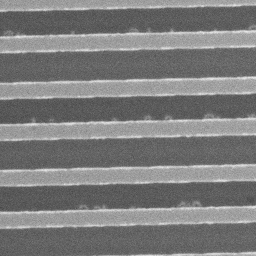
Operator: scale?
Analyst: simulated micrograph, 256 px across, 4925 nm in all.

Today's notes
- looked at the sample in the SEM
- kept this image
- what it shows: lines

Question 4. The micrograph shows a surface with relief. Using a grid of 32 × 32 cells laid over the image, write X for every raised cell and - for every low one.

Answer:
XXXXXXXXXXXXXXXXXXXXXXXXXXXXXXXX
--------------------------------
--------------------------------
--------------------------------
-----XXXXXXXXXXXXXXXXXXXXXXXXXXX
XXXXXXXXXXXXXXXXXXXXXXXXXXXXXXXX
XXX-----------------------------
--------------------------------
--------------------------------
--------------------------------
XXXXXXXXXXXXXXXXXXXXXXXXXXXXXXXX
XXXXXXXXXXXXXXXXXXXXXXXXXXXXXXXX
--------------------------------
--------------------------------
--------------------------------
--XXXXXXXXXXXXXXXXXXXXXXXXXXXXXX
XXXXXXXXXXXXXXXXXXXXXXXXXXXXXXXX
--------------------------------
--------------------------------
--------------------------------
--------------------------------
XXXXXXXXXXXXXXXXXXXXXXXXXXXXXXXX
XXXXXXXXXXXXXXXXXXXXXXXXXXXXXXXX
--------------------------------
--------------------------------
--------------------------------
--XXXXXXXXXXXXXXXXXXXXXXXXXXXXXX
XXXXXXXXXXXXXXXXXXXXXXXXXXXXXXXX
--------------------------------
--------------------------------
--------------------------------
--------------------------------